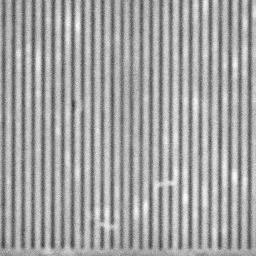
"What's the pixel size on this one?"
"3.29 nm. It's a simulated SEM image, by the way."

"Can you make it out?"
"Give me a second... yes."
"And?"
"parallel lines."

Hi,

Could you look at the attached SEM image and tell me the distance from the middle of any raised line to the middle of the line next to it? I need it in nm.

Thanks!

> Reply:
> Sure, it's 32.4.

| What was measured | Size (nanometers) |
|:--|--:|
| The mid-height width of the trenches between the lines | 9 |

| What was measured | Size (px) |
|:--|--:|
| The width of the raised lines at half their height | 7.23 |